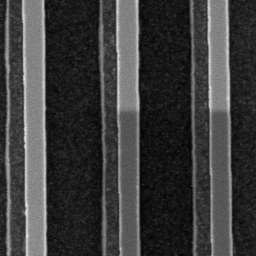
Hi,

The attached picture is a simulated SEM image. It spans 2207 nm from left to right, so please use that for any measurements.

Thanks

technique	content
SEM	lines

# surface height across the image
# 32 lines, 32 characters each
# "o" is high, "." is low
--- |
.oooo........oooo.......oooo....
.ooooo.......oooo.......oooo....
.oooo........oooo.......oooo....
.ooooo.......oooo.......ooooo...
.ooooo.......oooo.......ooooo...
.ooooo.......oooo.......ooooo...
.ooooo.......oooo.......ooooo...
.ooooo.......oooo.......ooooo...
.ooooo.......oooo.......ooooo...
.ooooo.......oooo.......ooooo...
.ooooo.......oooo.......ooooo...
.ooooo.......oooo.......ooooo...
.ooooo.......oooo.......ooooo...
.ooooo.......oooo.......ooooo...
.ooooo.......oooo.......ooooo...
.ooooo.......oooo.......ooooo...
.ooooo.......oooo.......ooooo...
.ooooo.......oooo.......ooooo...
.ooooo.......oooo.......ooooo...
.ooooo.......oooo.......ooooo...
.ooooo.......oooo.......ooooo...
.ooooo.......oooo.......ooooo...
.ooooo.......oooo.......ooooo...
.ooooo.......oooo.......ooooo...
.ooooo.......oooo.......ooooo...
.ooooo.......oooo.......ooooo...
.ooooo.......oooo.......ooooo...
.ooooo.......oooo.......ooooo...
.ooooo.......oooo.......ooooo...
.ooooo.......oooo.......ooooo...
.ooooo.......oooo.......ooooo...
.ooooo.......oooo.......ooooo...